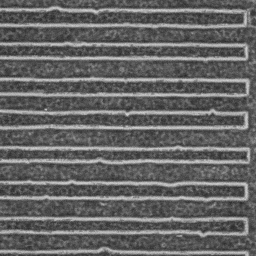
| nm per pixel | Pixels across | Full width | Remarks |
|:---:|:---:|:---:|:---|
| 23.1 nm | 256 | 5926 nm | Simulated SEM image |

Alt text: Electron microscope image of parallel lines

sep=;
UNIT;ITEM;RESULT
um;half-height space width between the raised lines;0.472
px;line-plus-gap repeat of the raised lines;34.7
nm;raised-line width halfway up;341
